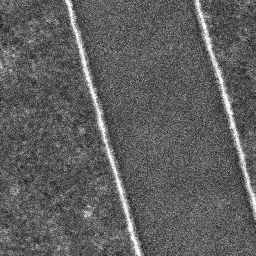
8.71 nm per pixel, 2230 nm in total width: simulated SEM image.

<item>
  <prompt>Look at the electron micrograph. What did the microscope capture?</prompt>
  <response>one or a few lines or trenches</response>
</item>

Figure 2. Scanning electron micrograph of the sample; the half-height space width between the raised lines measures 1090 nm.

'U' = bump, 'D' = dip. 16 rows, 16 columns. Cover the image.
UUUUDDDDDDDDUUUU
UUUUUDDDDDDDDUUU
UUUUUDDDDDDDDUUU
UUUUUDDDDDDDDUUU
UUUUUDDDDDDDDDUU
UUUUUUDDDDDDDDUU
UUUUUUDDDDDDDDUU
UUUUUUDDDDDDDDUU
UUUUUUUDDDDDDDDU
UUUUUUUDDDDDDDDU
UUUUUUUDDDDDDDDU
UUUUUUUDDDDDDDDD
UUUUUUUUDDDDDDDD
UUUUUUUUDDDDDDDD
UUUUUUUUDDDDDDDD
UUUUUUUUUDDDDDDD